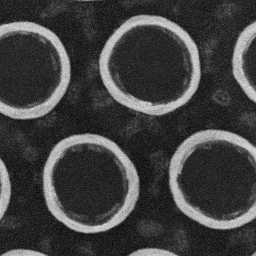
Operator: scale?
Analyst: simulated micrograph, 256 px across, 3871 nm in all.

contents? raised bodies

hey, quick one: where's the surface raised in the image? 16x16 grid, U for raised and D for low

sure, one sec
DDDDDDDDDDDDDDDD
DDDDDDDDUUDDDDDD
UUUDDDDUUUUUDDDU
UUUUDDDUUUUUDDDU
UUUUDDDUUUUUDDDU
UUUUDDDUUUUUDDDU
UUUDDDDDUUUDDDDD
DDDDDDDDDDDDDDDD
DDDDDDDDDDDDDUDD
DDDDUUUDDDDUUUUU
DDDUUUUUDDDUUUUU
DDDUUUUUDDDUUUUU
DDDUUUUUDDDUUUUU
DDDDUUUDDDDDUUUU
DDDDDDDDDDDDDDDD
DDDDDDDDDDDDDDDD